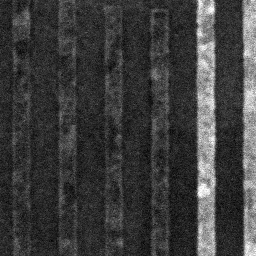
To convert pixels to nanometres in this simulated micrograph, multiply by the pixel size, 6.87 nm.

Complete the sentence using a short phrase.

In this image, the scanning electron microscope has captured parallel lines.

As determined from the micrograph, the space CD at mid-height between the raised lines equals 31.1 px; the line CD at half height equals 104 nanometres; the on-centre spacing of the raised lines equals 0.317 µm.